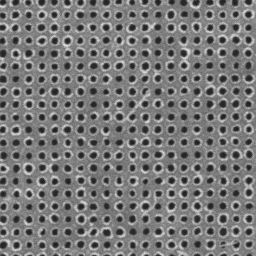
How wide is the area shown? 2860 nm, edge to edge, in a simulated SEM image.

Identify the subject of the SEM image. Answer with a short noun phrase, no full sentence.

a regular array of holes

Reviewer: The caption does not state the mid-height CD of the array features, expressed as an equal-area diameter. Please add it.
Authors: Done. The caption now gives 0.0787 um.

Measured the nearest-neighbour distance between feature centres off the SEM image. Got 0.14 um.